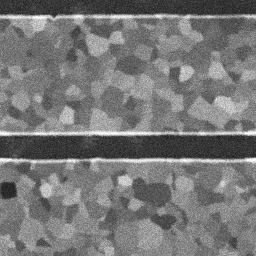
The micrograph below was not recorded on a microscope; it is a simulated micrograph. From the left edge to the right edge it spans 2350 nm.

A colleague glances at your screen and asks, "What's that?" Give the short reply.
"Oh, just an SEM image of one or a few lines or trenches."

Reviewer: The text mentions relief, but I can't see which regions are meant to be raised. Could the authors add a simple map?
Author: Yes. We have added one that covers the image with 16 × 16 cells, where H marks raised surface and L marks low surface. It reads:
LLLLLLLLLLLLLLLL
HHHHHHHHHHHHHHHH
HHHHHHHHHHHHHHHH
HHHHHHHHHHHHHHHH
HHHHHHHHHHHHHHHH
HHHHHHHHHHHHHHHH
HHHHHHHHHHHHHHHH
HHHHHHHHHHHHHHHH
LLLLLLLLLLLLLLLL
LLLLLLLLLLLLLLLL
HHHHHHHHHHHHHHHH
HHHHHHHHHHHHHHHH
HHHHHHHHHHHHHHHH
HHHHHHHHHHHHHHHH
HHHHHHHHHHHHHHHH
HHHHHHHHHHHHHHHH